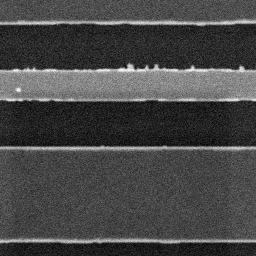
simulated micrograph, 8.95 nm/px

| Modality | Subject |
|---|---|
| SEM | lines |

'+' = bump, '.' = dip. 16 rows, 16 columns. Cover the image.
++++++++++++++++
................
................
................
++++++++++++++++
++++++++++++++++
................
................
................
++++++++++++++++
++++++++++++++++
++++++++++++++++
++++++++++++++++
++++++++++++++++
++++++++++++++++
................